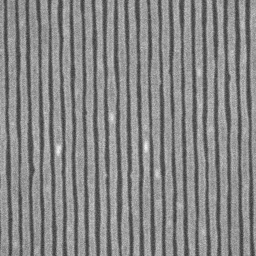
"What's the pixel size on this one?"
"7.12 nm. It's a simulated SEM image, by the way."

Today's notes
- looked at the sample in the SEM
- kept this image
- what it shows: parallel lines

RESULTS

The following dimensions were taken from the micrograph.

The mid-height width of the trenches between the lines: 0.0311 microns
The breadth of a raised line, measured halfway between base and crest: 0.0436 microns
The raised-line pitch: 0.0782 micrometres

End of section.